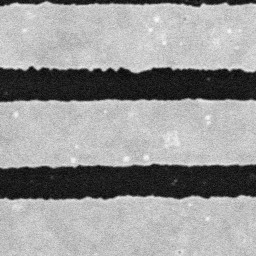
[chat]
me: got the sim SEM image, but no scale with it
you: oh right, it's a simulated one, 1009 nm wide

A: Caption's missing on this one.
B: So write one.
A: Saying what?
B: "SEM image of lines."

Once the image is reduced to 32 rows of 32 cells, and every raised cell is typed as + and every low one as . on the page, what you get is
.++..++.......+.....++.........+
++++++++++++++++++++++++++++++++
++++++++++++++++++++++++++++++++
++++++++++++++++++++++++++++++++
++++++++++++++++++++++++++++++++
++++++++++++++++++++++++++++++++
++++++++++++++++++++++++++++++++
++++++++++++++++++++++++++++++++
+++++.+++++++++++++..+++++++++++
................................
................................
................................
.......................+++......
++++++++++++++++++++++++++++++++
++++++++++++++++++++++++++++++++
++++++++++++++++++++++++++++++++
++++++++++++++++++++++++++++++++
++++++++++++++++++++++++++++++++
++++++++++++++++++++++++++++++++
++++++++++++++++++++++++++++++++
+++++++++++++++++++.++++++++++++
................................
................................
................................
................................
++++++++++++++++++++++++++++++++
++++++++++++++++++++++++++++++++
++++++++++++++++++++++++++++++++
++++++++++++++++++++++++++++++++
++++++++++++++++++++++++++++++++
++++++++++++++++++++++++++++++++
++++++++++++++++++++++++++++++++